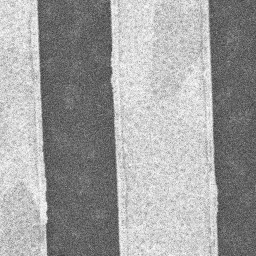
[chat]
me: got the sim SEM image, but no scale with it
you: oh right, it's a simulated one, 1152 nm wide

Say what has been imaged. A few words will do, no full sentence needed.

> one or a few lines or trenches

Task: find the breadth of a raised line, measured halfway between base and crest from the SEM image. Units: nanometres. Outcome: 436